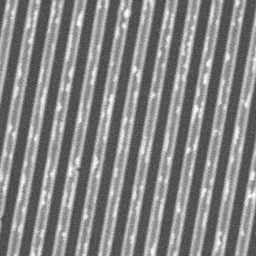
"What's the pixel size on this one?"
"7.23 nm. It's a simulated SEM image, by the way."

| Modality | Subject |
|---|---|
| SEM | parallel lines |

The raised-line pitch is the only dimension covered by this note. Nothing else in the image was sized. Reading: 0.162 µm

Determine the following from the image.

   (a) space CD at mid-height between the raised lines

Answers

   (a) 12.7 px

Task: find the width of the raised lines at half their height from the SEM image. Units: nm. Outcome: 72.9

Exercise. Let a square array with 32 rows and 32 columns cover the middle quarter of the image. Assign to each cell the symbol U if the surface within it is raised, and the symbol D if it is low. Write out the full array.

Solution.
UUDDDDUUDDDDUUDDDUUUDDDUUDDDDUUD
UUDDDDUUDDDUUUDDDUUDDDDUUDDDDUUD
UUDDDDUUDDDUUDDDDUUDDDDUUDDDUUUD
UUDDDUUUDDDUUDDDDUUDDDUUUDDDUUDD
UUDDDUUUDDDUUDDDUUUDDDUUUDDDUUDD
UUDDDUUDDDDUUDDDUUUDDDUUDDDDUUDD
UDDDDUUDDDUUUDDDUUUDDDUUDDDDUUDD
UDDDDUUDDDUUUDDDUUDDDDUUDDDUUUDD
UDDDUUUDDDUUDDDDUUDDDDUUDDDUUUDD
UDDDUUUDDDUUDDDDUUDDDUUUDDDUUDDD
UDDDUUDDDDUUDDDUUUDDDUUUDDDUUDDD
DDDDUUDDDDUUDDDUUUDDDUUDDDDUUDDD
DDDDUUDDDUUUDDDUUDDDDUUDDDDUUDDD
DDDUUUDDDUUDDDDUUDDDDUUDDDUUUDDD
DDDUUUDDDUUDDDDUUDDDUUUDDDUUDDDD
DDDUUUDDDUUDDDUUUDDDUUUDDDUUDDDD
DDDUUDDDDUUDDDUUUDDDUUDDDDUUDDDU
DDDUUDDDDUUDDDUUUDDDUUDDDUUUDDDU
DDDUUDDDUUUDDDUUDDDDUUDDDUUUDDDU
DDUUUDDDUUDDDDUUDDDDUUDDDUUUDDDU
DDUUUDDDUUDDDDUUDDDUUUDDDUUDDDDU
DDUUDDDDUUDDDDUUDDDUUUDDDUUDDDDU
DDUUDDDDUUDDDUUUDDDUUDDDDUUDDDUU
DDUUDDDUUUDDDUUDDDDUUDDDDUUDDDUU
DUUUDDDUUUDDDUUDDDDUUDDDUUUDDDUU
DUUUDDDUUDDDDUUDDDUUUDDDUUUDDDUU
DUUDDDDUUDDDDUUDDDUUUDDDUUDDDDUU
DUUDDDDUUDDDDUUDDDUUDDDDUUDDDUUU
DUUDDDDUUDDDUUUDDDUUDDDDUUDDDUUU
DUUDDDUUUDDDUUDDDDUUDDDDUUDDDUUU
UUUDDDUUDDDDUUDDDDUUDDDUUUDDDUUD
UUUDDDUUDDDDUUDDDUUUDDDUUDDDDUUD